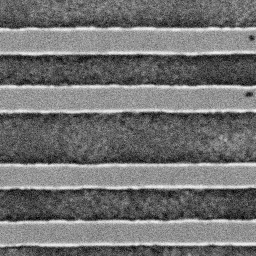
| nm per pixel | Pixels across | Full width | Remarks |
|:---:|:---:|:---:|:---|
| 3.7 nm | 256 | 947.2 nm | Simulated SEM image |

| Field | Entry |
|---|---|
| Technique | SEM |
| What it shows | lines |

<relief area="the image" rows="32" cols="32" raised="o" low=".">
................................
................................
................................
................................
oooooooooooooooooooooooooooooooo
oooooooooooooooooooooooooooooooo
oooooooooooooooooooooooooooooooo
................................
................................
................................
................................
oooooooooooooooooooooooooooooooo
oooooooooooooooooooooooooooooooo
oooooooooooooooooooooooooooooooo
................................
................................
................................
................................
................................
................................
.........................oo.oooo
oooooooooooooooooooooooooooooooo
oooooooooooooooooooooooooooooooo
ooo.oooooo...oooo...............
................................
................................
................................
................................
oooooooooooooooooooooooooooooooo
oooooooooooooooooooooooooooooooo
ooooooooooooooooooo.oooooo.o.ooo
................................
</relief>